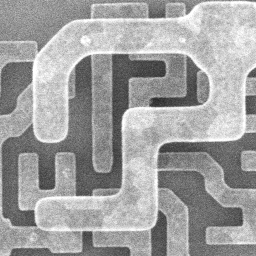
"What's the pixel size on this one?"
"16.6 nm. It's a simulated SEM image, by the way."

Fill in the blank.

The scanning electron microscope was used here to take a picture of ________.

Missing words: wiring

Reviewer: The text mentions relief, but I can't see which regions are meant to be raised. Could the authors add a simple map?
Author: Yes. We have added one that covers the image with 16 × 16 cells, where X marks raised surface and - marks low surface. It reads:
------------XXXX
----XXXXXXXXXXXX
---XXXXXXXXXXXXX
--XXX-------XXXX
--XX---------XXX
--XX---------XX-
--XX---------XX-
--XX----XXXXXXX-
--XX----XXXXXXX-
--------XX------
--------XX------
--------XX------
---XXXXXXX------
--XXXXXXXX------
----------------
----------------